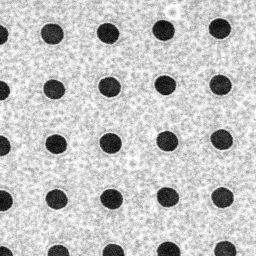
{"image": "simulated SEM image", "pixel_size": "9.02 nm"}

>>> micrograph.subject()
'a regular array of holes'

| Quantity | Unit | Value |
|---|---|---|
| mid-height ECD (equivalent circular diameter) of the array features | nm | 204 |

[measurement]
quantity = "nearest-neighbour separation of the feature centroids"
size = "492 nanometers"